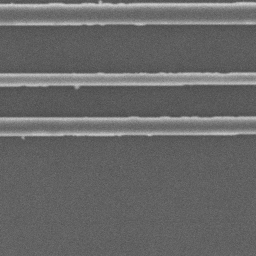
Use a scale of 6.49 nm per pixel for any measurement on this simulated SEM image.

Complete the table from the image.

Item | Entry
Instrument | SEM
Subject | lines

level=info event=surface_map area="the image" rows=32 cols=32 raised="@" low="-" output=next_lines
------@@-----@@@@@@@@@@@@@@@@@@@
@@@@@@@@@@@@@@@@@@@@@@@@@@@@@@@@
@@@@@@@@@@@@@@@@@@@@@@@@@@@@@@@@
--------------------------------
--------------------------------
--------------------------------
--------------------------------
--------------------------------
--------------------------------
@@@@@@@@@@@@@@@@@@@@@@@@@@@@@@@@
@@@@@@@@@@@@@@@@@@@@@@@@@@@@@@@@
--------------------------------
--------------------------------
--------------------------------
--------------------------------
@@@@@@@@@@@@@@@@@@@@@@@@@@@@@@@@
@@@@@@@@@@@@@@@@@@@@@@@@@@@@@@@@
--------------------------------
--------------------------------
--------------------------------
--------------------------------
--------------------------------
--------------------------------
--------------------------------
--------------------------------
--------------------------------
--------------------------------
--------------------------------
--------------------------------
--------------------------------
--------------------------------
--------------------------------